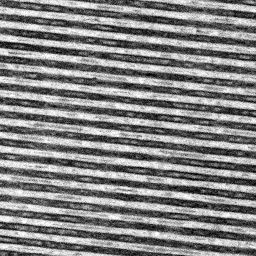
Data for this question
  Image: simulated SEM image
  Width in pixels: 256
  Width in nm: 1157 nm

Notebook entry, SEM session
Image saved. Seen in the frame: parallel lines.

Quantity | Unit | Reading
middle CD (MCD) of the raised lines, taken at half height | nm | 23.6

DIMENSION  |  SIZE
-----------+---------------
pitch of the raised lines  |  0.0625 µm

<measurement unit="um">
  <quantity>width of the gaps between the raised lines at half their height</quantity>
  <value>0.0399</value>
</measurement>